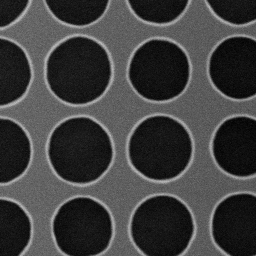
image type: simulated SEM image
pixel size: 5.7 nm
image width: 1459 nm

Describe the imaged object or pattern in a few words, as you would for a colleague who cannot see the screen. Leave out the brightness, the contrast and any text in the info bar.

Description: holes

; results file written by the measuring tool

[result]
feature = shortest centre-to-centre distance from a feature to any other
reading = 78.8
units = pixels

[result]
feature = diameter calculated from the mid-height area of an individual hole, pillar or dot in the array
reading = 65.1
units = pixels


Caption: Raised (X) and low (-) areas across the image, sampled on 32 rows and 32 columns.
----XX--------XX-------XXX------
---XXX-------XXXX------XXXX-----
--XXXXX-----XXXXXX----XXXXXX----
XXXXXXXXXXXXXXXXXXXXXXXXXXXXXXXX
XXXXXXXXX-XXXXXXXXXXXXXXXXXXXXXX
--XXXXXX----XXXXXX----XXXXXX----
---XXX-------XXXX------XXXX-----
----XX--------XX-------XXX------
----XX--------XX--------XX------
----XX--------XX--------XX------
----XX--------XX-------XXXX-----
---XXXX------XXXX------XXXXX----
--XXXXXX----XXXXXXX--XXXXXXXXXXX
XXXXXXXXXXXXXXXXXXXXXXXXXXXXXXXX
XXXXXXXXXXXXXXXXXXX--XXXXXXXXXXX
--XXXXXX----XXXXX------XXXXX----
---XXXX------XXXX------XXXX-----
----XX--------XX--------XXX-----
----XX--------XX--------XX------
----XX--------XX--------XXX-----
----XX--------XX--------XXX-----
---XXXX------XXXX------XXXXX----
--XXXXXX----XXXXXXX--XXXXXXXXXXX
XXXXXXXXXXXXXXXXXXXXXXXXXXXXXXXX
XXXXXXXXXXXXXXXXXXX--XXXXXXXX---
--XXXXXX-----XXXXX-----XXXX-----
---XXXX-------XXX-------XXX-----
----XXX-------XX--------XXX-----
----XXX-------XX--------XXX-----
----XXX-------XX--------XXX-----
---XXXX-------XXX-------XXX-----
---XXXXX-----XXXXX-----XXXXX----